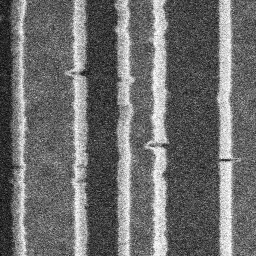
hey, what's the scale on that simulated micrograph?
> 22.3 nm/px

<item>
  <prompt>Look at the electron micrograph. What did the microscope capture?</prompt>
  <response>one or a few lines or trenches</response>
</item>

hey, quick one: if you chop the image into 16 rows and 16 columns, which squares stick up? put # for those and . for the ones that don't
.####...##....##
.####...##....##
.####...##....##
.####...##....##
.####...##....##
.####...##....##
.####...##....##
.####...##....##
.####...##....##
.####...##....##
.####...##....##
.####...##....##
.####...##....##
.####...##....##
.####...##....##
.####...##....##